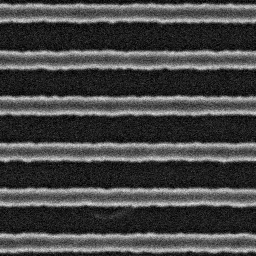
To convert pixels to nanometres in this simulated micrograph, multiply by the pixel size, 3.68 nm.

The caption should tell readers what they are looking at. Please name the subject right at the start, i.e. lines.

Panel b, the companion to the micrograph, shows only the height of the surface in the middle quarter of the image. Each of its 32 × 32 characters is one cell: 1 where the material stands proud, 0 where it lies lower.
11111111111111111111111111111111
00000000000000000000000000000000
00000000000000000000000000000000
00000000000000000000000000000000
00000000000000000000000000000000
00000000000000000000000000000000
00000000000000000000000000000000
00000000000000000000000000000000
11111011111000111101110111111111
11111111111111111111111111111111
11111111111111111111111111111111
11111111111111111111111111111111
01111110111111110111111111101111
00000000000000000000000000000000
00000000000000000000000000000000
00000000000000000000000000000000
00000000000000000000000000000000
00000000000000000000000000000000
00000000000000000000000000000000
00000000000000000000000000000000
11111111111111111111111111111111
11111111111111111111111111111111
11111111111111111111111111111111
11111111111111111111111111111111
00000000000000000000000000000000
00000000000000000000000000000000
00000000000000000000000000000000
00000000000000000000000000000000
00000000000000000000000000000000
00000000000000000000000000000000
00000000000000000000000000000000
01111111110011111011101111001011